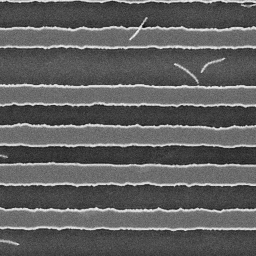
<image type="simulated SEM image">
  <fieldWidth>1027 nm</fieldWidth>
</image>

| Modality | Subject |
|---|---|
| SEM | lines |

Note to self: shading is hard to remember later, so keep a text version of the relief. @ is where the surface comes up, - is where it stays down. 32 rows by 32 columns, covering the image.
--------------------------------
--------------------------------
--------------------------------
-@@@@@@@--@--@@@@@@@@@@------@-@
@@@@@@@@@@@@@@@@@@@@@@@@@@@@@@@@
@@@@@@@@@@@@@@@@@@@@@@@@@@@@@@@@
--------------------------------
--------------------------------
--------------------------------
--------------------------------
--------------------------------
@@@@@@@@@@@@@@@@@@@@@@@@@@@@@@@@
@@@@@@@@@@@@@@@@@@@@@@@@@@@@@@@@
--------------------------------
--------------------------------
--@@----------------------------
@@@@@@@@@@@@@@@@@@@@@@@@@@@@@@@@
@@@@@@@@@@@@@@@@@@@@@@@@@@@@@@@@
--------------------------------
--------------------------------
--@@@@@@@@----------------------
@@@@@@@@@@@@@@@@@@@@@@@@@@@@@@@@
@@@@@@@@@@@@@@@@@@@@@@@@@@@@@@@@
--------------------------------
--------------------------------
--------------------------------
@@@@@@@@@@@@@@@@@@@@@@@@@@@@@@@@
@@@@@@@@@@@@@@@@@@@@@@@@@@@@@@@@
@@@@@-@@-@@@@@@@@@@@@@@@@@@@@@@@
--------------------------------
--------------------------------
--------------------------------